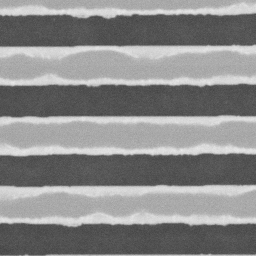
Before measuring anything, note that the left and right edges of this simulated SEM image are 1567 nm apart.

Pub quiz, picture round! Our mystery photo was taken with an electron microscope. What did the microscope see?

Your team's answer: lines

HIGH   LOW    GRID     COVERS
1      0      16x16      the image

1111111111111111
0000000000000000
0000000000000000
1111111111111111
1111111111111111
0000000000000000
0000000000000000
1111111111111111
1111111111111111
1111111111111111
0000000000000000
0000000000000000
1111111111111111
1111111111111111
0000000000000000
0000000000000000